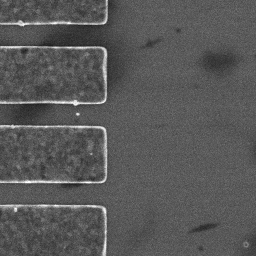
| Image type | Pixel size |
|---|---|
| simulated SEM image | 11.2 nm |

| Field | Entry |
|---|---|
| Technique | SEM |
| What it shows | wiring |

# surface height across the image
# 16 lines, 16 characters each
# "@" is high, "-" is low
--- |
@@@@@@@---------
-@--------------
----------------
@@@@@@@---------
@@@@@@@---------
@@@@@@@---------
----------------
----------------
@@@@@@@---------
@@@@@@@---------
@@@@@@@---------
----------------
----------------
@@@@@@@---------
@@@@@@@---------
@@@@@@@---------